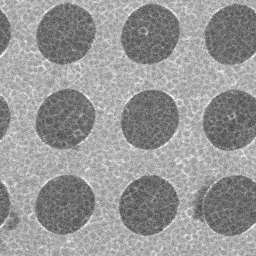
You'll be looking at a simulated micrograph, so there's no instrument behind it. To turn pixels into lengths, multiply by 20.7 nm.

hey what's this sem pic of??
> raised bodies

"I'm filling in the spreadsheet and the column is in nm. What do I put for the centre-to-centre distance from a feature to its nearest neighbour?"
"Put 1740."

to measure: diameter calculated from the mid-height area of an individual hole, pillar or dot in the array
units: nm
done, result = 1250